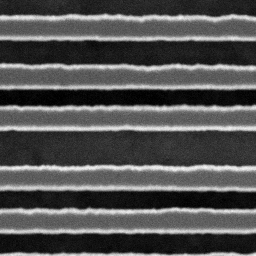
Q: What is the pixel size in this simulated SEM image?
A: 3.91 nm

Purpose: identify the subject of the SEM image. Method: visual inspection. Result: lines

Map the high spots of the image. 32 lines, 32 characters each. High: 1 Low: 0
00000000000000000000000000000000
00000000000000000000000000000000
11111111111111111111111111111111
11111111111111111111111111111111
11111111111111111111111111111111
00000000000000000000000000000000
00000000000000000000000000000000
00000000000000000000000000000000
11111111111111111111111111111111
11111111111111111111111111111111
11111111111111111111111111111111
00000000000000000000000000000000
00000000000000000000000000000000
11111111111111111111111111111111
11111111111111111111111111111111
11111111111111111111111111111111
00000000000000000000000000000000
00000000000000000000000000000000
00000000000000000000000000000000
00000000000000000000000000000000
00000000000000000000000000000000
11111111111111111111111111111111
11111111111111111111111111111111
11111111111111111111111111111111
00000000000000000000000000000000
00000000000000000000000000000000
11111111111111111111111111111111
11111111111111111111111111111111
11111111111111111111111111111111
00000000000000000000000000000000
00000000000000000000000000000000
00000000000000000000000000000000